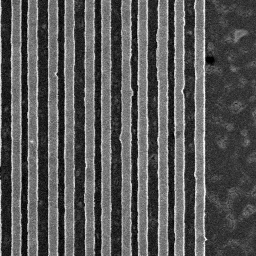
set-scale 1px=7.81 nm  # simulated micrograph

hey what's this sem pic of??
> parallel lines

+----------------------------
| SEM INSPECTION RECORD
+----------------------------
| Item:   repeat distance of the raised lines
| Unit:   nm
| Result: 143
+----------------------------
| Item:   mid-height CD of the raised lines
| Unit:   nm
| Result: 71.3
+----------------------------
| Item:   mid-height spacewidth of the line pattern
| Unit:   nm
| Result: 85.9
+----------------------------